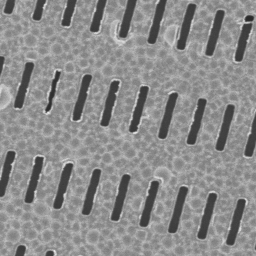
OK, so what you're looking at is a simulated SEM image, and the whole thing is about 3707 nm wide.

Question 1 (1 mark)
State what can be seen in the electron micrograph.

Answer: a regular array of holes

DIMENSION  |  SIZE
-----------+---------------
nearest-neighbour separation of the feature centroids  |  0.425 microns